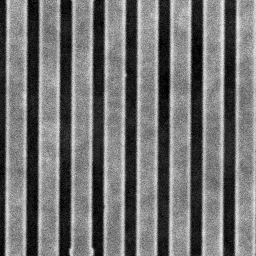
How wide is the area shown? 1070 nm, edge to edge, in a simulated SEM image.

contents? parallel lines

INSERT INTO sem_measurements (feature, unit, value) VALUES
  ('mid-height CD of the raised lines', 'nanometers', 82.6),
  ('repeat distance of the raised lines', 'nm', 137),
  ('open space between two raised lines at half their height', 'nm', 54.9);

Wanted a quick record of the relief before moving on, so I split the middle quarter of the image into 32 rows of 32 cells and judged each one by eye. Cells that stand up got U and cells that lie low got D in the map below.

DDUUUUUDDDUUUUUDDDDUUUUDDDDUUUUD
DDUUUUUDDDUUUUUDDDDUUUUDDDDUUUUD
DDUUUUUDDDUUUUUDDDDUUUUDDDDUUUUD
DDUUUUUDDDUUUUUDDDDUUUUDDDDUUUUD
DDUUUUUDDDUUUUUDDDDUUUUDDDDUUUUD
DDUUUUUDDDUUUUUDDDDUUUUDDDDUUUUD
DDUUUUUDDDUUUUUDDDDUUUUDDDDUUUUD
DDUUUUUDDDUUUUUDDDDUUUUDDDDUUUUD
DDUUUUUDDDUUUUUDDDDUUUUDDDDUUUUD
DDUUUUUDDDUUUUUDDDDUUUUDDDDUUUUD
DDUUUUUDDDUUUUUDDDDUUUUDDDDUUUUD
DDUUUUUDDDUUUUUDDDDUUUUDDDDUUUUD
DDUUUUUDDDUUUUUDDDDUUUUDDDDUUUUD
DDUUUUUDDDUUUUUDDDDUUUUDDDDUUUUD
DDUUUUUDDDUUUUUDDDDUUUUDDDDUUUUD
DDUUUUUDDDUUUUUDDDDUUUUDDDDUUUUD
DDUUUUUDDDUUUUUDDDDUUUUDDDDUUUUD
DDUUUUUDDDUUUUUDDDDUUUUDDDDUUUUD
DDUUUUUDDDUUUUUDDDDUUUUDDDDUUUUD
DDUUUUUDDDUUUUUDDDUUUUUDDDDUUUUD
DDUUUUUDDDUUUUUDDDUUUUUDDDDUUUUD
DDUUUUUDDDUUUUUDDDUUUUUDDDDUUUUD
DDUUUUUDDDUUUUUDDDUUUUUDDDDUUUUD
DDUUUUUDDDUUUUUDDDUUUUUDDDDUUUUD
DDUUUUUDDDUUUUUDDDUUUUUDDDDUUUUD
DDUUUUUDDDUUUUUDDDUUUUUDDDDUUUUD
DDUUUUUDDDUUUUUDDDUUUUUDDDDUUUUD
DDUUUUUDDDUUUUUDDDUUUUUDDDDUUUUD
DDUUUUUDDDUUUUUDDDUUUUUDDDDUUUUD
DDUUUUUDDDUUUUUDDDUUUUUDDDDUUUUD
DDUUUUUDDDUUUUUDDDUUUUUDDDDUUUUD
DDUUUUUDDDUUUUUDDDUUUUUDDDDUUUUD